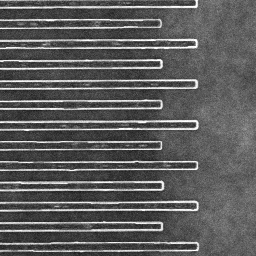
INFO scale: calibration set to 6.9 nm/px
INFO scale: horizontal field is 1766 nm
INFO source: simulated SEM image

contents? parallel lines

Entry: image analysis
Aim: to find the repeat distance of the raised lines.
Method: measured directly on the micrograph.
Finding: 0.14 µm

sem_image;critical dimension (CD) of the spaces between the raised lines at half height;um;0.0819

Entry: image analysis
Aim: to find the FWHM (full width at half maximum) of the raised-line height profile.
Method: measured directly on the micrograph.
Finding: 62.9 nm